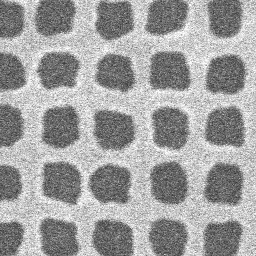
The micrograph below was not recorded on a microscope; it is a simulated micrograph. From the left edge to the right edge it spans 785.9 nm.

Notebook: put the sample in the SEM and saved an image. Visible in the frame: a regular array of holes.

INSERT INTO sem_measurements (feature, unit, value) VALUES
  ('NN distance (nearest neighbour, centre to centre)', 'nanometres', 166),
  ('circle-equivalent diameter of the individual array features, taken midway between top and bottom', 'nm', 134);